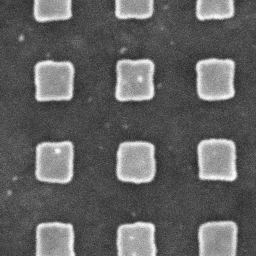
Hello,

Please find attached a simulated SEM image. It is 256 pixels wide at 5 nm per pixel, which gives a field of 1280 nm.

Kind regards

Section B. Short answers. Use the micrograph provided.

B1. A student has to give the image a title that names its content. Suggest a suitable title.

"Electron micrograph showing raised bodies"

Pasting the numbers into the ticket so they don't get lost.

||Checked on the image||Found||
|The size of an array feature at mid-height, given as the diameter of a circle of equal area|207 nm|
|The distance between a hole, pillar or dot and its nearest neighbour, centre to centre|0.404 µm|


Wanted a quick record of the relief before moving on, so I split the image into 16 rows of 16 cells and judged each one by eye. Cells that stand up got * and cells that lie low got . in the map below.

..**...***..***.
................
................
................
..***..***..***.
..***..**...***.
................
................
................
..***..***..***.
..**...***..***.
................
................
................
..***...**...**.
..***..***...**.